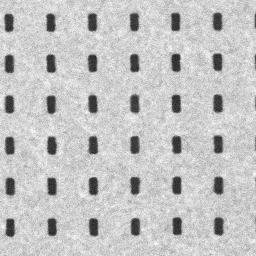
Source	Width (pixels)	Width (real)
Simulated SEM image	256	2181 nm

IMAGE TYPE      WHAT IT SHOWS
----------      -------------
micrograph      a regular array of holes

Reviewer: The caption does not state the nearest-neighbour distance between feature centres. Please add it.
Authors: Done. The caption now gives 347 nm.